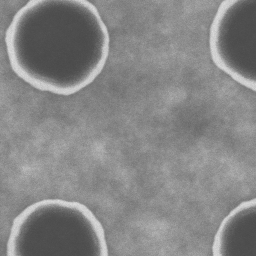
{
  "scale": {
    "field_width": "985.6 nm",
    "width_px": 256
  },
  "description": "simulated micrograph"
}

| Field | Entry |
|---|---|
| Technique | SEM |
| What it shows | raised bodies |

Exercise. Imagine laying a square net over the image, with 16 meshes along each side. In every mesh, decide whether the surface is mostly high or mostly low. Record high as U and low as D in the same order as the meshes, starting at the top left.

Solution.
DDUUUUDDDDDDDDUU
DUUUUUDDDDDDDUUU
DUUUUUUDDDDDDUUU
DUUUUUUDDDDDDUUU
DUUUUUDDDDDDDDUU
DDDUUDDDDDDDDDDD
DDDDDDDDDDDDDDDD
DDDDDDDDDDDDDDDD
DDDDDDDDDDDDDDDD
DDDDDDDDDDDDDDDD
DDDDDDDDDDDDDDDD
DDDDDDDDDDDDDDDD
DDDDDDDDDDDDDDDD
DUUUUUDDDDDDDDUU
DUUUUUDDDDDDDDUU
DUUUUUUDDDDDDUUU